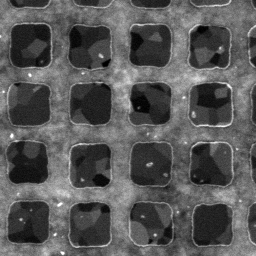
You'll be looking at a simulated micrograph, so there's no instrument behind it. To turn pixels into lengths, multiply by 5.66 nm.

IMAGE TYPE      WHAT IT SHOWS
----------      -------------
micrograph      a regular array of raised bodies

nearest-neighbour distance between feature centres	331	nm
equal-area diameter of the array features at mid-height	270	nanometres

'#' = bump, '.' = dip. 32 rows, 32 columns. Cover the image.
.#####...#####...####...####....
................................
................................
..####...#####..#####...####....
.#####...#####..#####...#####..#
.######..#####..#####...#####..#
.#####...#####..#####...#####..#
.#####...#####..#####..######..#
..........###...........####....
................................
..####...####....####....###....
.#####...#####..#####...#####..#
.#####...#####..#####...#####..#
.#####...#####..#####...#####..#
.#####...#####..#####...#####..#
..####....###....####...#####...
................................
................................
.#####...#####..#####...#####..#
.#####...#####..######..#####..#
.#####...#####..######..#####..#
.#####...#####..#####...#####..#
.#####...#####..#####...#####...
.........##.....................
................................
..####...####....####......#....
.#####...#####..######..#####..#
.#####...#####..######..#####..#
.#####...#####..######..#####..#
.#####...#####..######..#####..#
....#....#####...####...#####...
................................